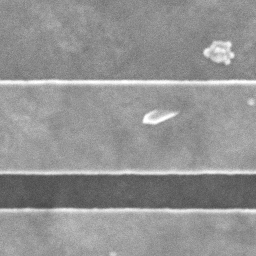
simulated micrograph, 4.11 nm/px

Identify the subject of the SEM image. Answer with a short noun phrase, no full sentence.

lines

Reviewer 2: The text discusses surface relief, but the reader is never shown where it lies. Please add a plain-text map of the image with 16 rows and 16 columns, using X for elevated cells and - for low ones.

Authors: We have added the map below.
----------------
----------------
----------------
----------------
----------------
XXXXXXXXXXXXXXXX
XXXXXXXXXXXXXXXX
XXXXXXXXXXXXXXXX
XXXXXXXXXXXXXXXX
XXXXXXXXXXXXXXXX
XXXXXXXXXXXXXXXX
----------------
----------------
XXXXXXXXXXXXXXXX
XXXXXXXXXXXXXXXX
XXXXXXXXXXXXXXXX